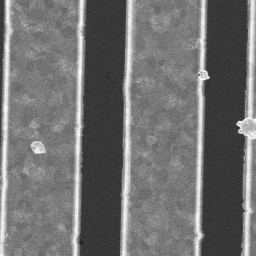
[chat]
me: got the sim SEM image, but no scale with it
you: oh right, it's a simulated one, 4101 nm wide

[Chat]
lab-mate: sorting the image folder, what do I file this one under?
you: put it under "one or a few lines or trenches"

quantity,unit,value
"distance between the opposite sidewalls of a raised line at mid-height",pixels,73.1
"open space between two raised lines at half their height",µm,0.785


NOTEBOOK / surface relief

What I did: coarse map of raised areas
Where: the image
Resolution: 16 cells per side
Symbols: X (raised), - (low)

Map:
XXXXX---XXXXX---
-XXXX---XXXXX---
-XXXX---XXXXX---
XXXXX---XXXXX---
XXXXX---XXXXX---
XXXXX---XXXXX---
XXXXX---XXXXX---
XXXXX---XXXX---X
XXXXX---XXXX---X
XXXXX---XXXX----
XXXXX---XXXX----
XXXXX---XXXX---X
XXXXX---XXXX---X
XXXXX---XXXX---X
XXXXX---XXXX---X
XXXXX---XXXX---X